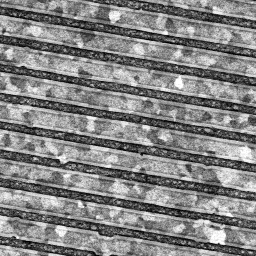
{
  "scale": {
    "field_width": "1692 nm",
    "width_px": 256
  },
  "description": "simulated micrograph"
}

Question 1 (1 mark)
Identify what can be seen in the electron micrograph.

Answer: parallel lines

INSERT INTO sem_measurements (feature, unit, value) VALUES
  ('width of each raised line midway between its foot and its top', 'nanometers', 109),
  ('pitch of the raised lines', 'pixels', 28.2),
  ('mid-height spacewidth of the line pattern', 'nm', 80.6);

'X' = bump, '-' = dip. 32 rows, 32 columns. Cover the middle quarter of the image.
XXXXXXXXXXXXXX------------------
XXXXXXXXXXXXXXXXXXXX------------
--XXXXXXXXXXXXXXXXXXXXXXXX------
--------XXXXXXXXXXXXXXXXXXXXXXXX
---------------XXXXXXXXXXXXXXXXX
XXX-----------------XXXXXXXXXXXX
XXXXXXXX------------------XXXXXX
XXXXXXXXXXXXXX------------------
XXXXXXXXXXXXXXXXXXXX------------
-XXXXXXXXXXXXXXXXXXXXXXX--------
------XXXXXXXXXXXXXXXXXXXXXXXX--
-------------XXXXXXXXXXXXXXXXXXX
-------------------XXXXXXXXXXXXX
XXXXXXX------------------XXXXXXX
XXXXXXXXXXXXX-----------------XX
XXXXXXXXXXXXXXXXXXX-------------
XXXXXXXXXXXXXXXXXXXXXXXXX-------
------XXXXXXXXXXXXXXXXXXXXXXXXX-
------------XXXXXXXXXXXXXXXXXXXX
------------------XXXXXXXXXXXXXX
XXXXXX------------------XXXXXXXX
XXXXXXXXXXX------------------XXX
XXXXXXXXXXXXXXXX----------------
XXXXXXXXXXXXXXXXXXXXXX----------
-----XXXXXXXXXXXXXXXXXXXXXXX----
----------XXXXXXXXXXXXXXXXXXXXXX
-----------------XXXXXXXXXXXXXXX
XXXX-------------------XXXXXXXXX
XXXXXXXXXX-------------------XXX
XXXXXXXXXXXXXXXX----------------
XXXXXXXXXXXXXXXXXXXXXX----------
----XXXXXXXXXXXXXXXXXXXXXXXX----